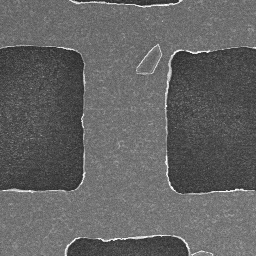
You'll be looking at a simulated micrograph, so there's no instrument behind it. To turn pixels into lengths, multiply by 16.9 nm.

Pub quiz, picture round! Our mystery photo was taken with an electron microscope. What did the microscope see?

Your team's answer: holes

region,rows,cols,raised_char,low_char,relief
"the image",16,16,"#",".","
################
################
################
.....######.....
.....######.....
.....######.....
.....#####......
.....#####......
.....#####......
.....#####......
.....######.....
.....######.....
################
################
################
####........####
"